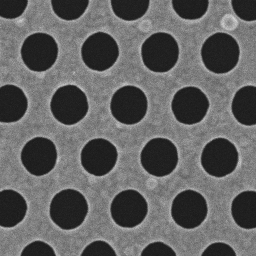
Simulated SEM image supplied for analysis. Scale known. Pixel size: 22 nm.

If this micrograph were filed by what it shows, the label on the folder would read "a regular array of holes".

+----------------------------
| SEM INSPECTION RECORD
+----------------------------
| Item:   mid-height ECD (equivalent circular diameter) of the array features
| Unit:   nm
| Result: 856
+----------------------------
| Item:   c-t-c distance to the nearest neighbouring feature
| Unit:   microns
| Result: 1.32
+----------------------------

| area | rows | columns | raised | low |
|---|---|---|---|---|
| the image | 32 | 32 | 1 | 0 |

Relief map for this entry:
00001100000111000001110000111000
00011110000111000011110000111000
11111111011111110111111111111100
11111111111111111111111111111111
11110011111000111110011111000111
11100001110000011100001110000011
11100001110000011100001110000011
11100001110000011100001110000011
11110011111000111100011111000111
11111111111111111111111111111111
11111111111111111111111111111111
00011110001111000011110001111100
00011100000111000011110000111000
00011100000111000011100000111000
00011110000111000011110000111000
11111111011111110111111011111100
11111111111111111111111111111111
11110011111001111110011111000111
11100001110000011100001110000011
11100001110000011100001110000011
11100001110000111100001110000011
11110011111000111100001111000111
11111111111111111111111111111111
11111111111111111111111111111111
00011110001111000011110001111000
00011100000111000011100000111000
00011100000111000011100000111000
00011110000111000011110000111000
11111111001111111111111011111100
11111111111111111111111111111111
11110011111001111110011111001111
11100001110000111100001110000111